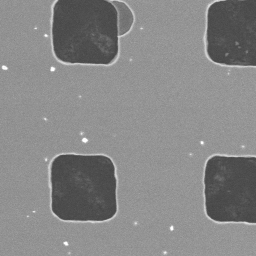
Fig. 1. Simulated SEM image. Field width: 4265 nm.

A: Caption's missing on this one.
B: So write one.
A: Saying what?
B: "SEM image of holes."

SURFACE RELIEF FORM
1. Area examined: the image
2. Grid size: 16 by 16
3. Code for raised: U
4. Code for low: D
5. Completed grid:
UUUDDDDUUUUUUDDD
UUUDDDDUUUUUUDDD
UUUDDDDUUUUUUDDD
UUUUDDDUUUUUUDDD
UUUUUUUUUUUUUUUU
UUUUUUUUUUUUUUUU
UUUUUUUUUUUUUUUU
UUUUUUUUUUUUUUUU
UUUUUUUUUUUUUUUU
UUUUUUUUUUUUUUUU
UUUDDDDUUUUUUDDD
UUUDDDDUUUUUUDDD
UUUDDDDUUUUUUDDD
UUUUDDDUUUUUUDDD
UUUUUUUUUUUUUUUU
UUUUUUUUUUUUUUUU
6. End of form